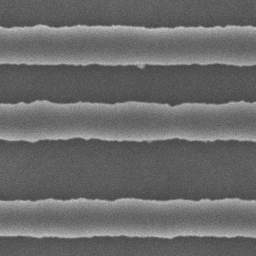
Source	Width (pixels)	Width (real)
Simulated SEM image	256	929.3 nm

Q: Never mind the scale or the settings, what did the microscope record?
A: lines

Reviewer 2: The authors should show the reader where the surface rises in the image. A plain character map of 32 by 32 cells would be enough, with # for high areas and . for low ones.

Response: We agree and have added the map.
................................
................................
................................
##################..#.##########
################################
################################
################################
################################
................................
................................
................................
................................
................................
################################
################################
################################
################################
.####........#######...####...##
................................
................................
................................
................................
................................
................................
................................
################################
################################
################################
################################
....########....######...#.#####
................................
................................